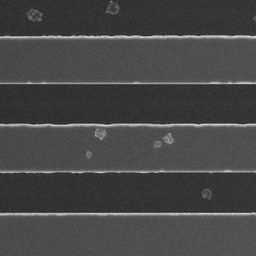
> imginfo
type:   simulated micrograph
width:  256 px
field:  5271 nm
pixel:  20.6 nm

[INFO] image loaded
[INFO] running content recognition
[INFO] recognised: lines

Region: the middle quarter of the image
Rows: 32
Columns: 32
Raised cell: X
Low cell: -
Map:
XXXXXXXXXXXXXXXXXXXXXXXXXXXXXXXX
XXXXXXXXXXXXXXXXXXXXXXXXXXXXXXXX
XXXXXXXXXXXXXXXXXXXXXXXXXXXXXXXX
XXXXXXXXXXXXXXXXXXXXXXXXXXXXXXXX
XXXXXXXXXXXXXXXXXXXXXXXXXXXXXXXX
--------------------------------
--------------------------------
--------------------------------
--------------------------------
--------------------------------
--------------------------------
--------------------------------
--------------------------------
--------------------------------
--------------------------------
XXXXXXXXXXXXXXXXXXXXXXXXXXXXXXXX
XXXXXXXXXXXXXXXXXXXXXXXXXXXXXXXX
XXXXXXXXXXXXXXXXXXXXXXXXXXXXXXXX
XXXXXXXXXXXXXXXXXXXXXXXXXXXXXXXX
XXXXXXXXXXXXXXXXXXXXXXXXXXXXXXXX
XXXXXXXXXXXXXXXXXXXXXXXXXXXXXXXX
XXXXXXXXXXXXXXXXXXXXXXXXXXXXXXXX
XXXXXXXXXXXXXXXXXXXXXXXXXXXXXXXX
XXXXXXXXXXXXXXXXXXXXXXXXXXXXXXXX
XXXXXXXXXXXXXXXXXXXXXXXXXXXXXXXX
XXXXXXXXXXXXXXXXXXXXXXXXXXXXXXXX
XXXXXXXXXXXXXXXXXXXXXXXXXXXXXXXX
--------------------------------
--------------------------------
--------------------------------
--------------------------------
--------------------------------